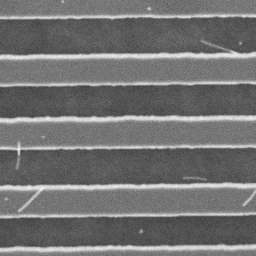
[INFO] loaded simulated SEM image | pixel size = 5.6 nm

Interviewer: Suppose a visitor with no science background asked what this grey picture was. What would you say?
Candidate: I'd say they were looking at lines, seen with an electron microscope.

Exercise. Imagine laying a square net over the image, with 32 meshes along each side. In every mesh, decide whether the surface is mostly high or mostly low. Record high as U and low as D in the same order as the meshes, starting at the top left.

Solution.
UUUUUUUUUUUUUUUUUUUUUUUUUUUUUUUU
UUUUUUUUUUUUUUUUUUUUUUUUUUUUUUUU
DDDDDDDDDDDDDDDDDDDDDDDDDDDDDDDD
DDDDDDDDDDDDDDDDDDDDDDDDDDDDDDDD
DDDDDDDDDDDDDDDDDDDDDDDDDDDDDDDD
DDDDDDDDDDDDDDDDDDDDDDDDDDDDDDDD
DDDDDDDDDDDDDDDDDDDDDDDDDDDDDDDD
UUUUUUUUUUUUUUUUUUUUUUUUUUUUUUUU
UUUUUUUUUUUUUUUUUUUUUUUUUUUUUUUU
UUUUUUUUUUUUUUUUUUUUUUUUUUUUUUUU
UUUUUUUUUUUUUUUUUUUUUUDUUDDDDDDD
DDDDDDDDDDDDDDDDDDDDDDDDDDDDDDDD
DDDDDDDDDDDDDDDDDDDDDDDDDDDDDDDD
DDDDDDDDDDDDDDDDDDDDDDDDDDDDDDDD
DDDDDDDDDDDDDDDDDDDDDDDDDDDDDDDD
UUUUUUUUUUUUUUUUUUUUUUUUUUUUUUUU
UUUUUUUUUUUUUUUUUUUUUUUUUUUUUUUU
UUUUUUUUUUUUUUUUUUUUUUUUUUUUUUUU
UUUUUUUUUUUUUUUUUUUUUDDDDDDDDUDD
DDDDDDDDDDDDDDDDDDDDDDDDDDDDDDDD
DDDDDDDDDDDDDDDDDDDDDDDDDDDDDDDD
DDDDDDDDDDDDDDDDDDDDDDDDDDDDDDDD
DDDDDDDDDDDDDDDDDDDDDDDDDDDDDDDD
UUUUUUUUUUUUUUUUUUUUUUUUUUUUUUUU
UUUUUUUUUUUUUUUUUUUUUUUUUUUUUUUU
UUUUUUUUUUUUUUUUUUUUUUUUUUUUUUUU
UUUUUUUUUUUUUUUUUUUUUUUUUUUUUUUU
DDDDDDDDDDDDDDDDDDDDDDDDDDDDDDDD
DDDDDDDDDDDDDDDDDDDDDDDDDDDDDDDD
DDDDDDDDDDDDDDDDDDDDDDDDDDDDDDDD
DDDDDDDDDDDDDDDDDDDDDDDDDDDDDDDD
UUUUUUUUUUUUUUUUUUUUUUUUUUUUUUUU